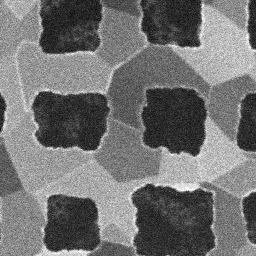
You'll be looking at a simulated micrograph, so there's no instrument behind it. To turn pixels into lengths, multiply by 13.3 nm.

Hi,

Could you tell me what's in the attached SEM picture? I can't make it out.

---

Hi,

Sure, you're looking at holes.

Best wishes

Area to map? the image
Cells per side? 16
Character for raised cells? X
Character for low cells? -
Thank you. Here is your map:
XX----XXX----XX-
XXX---XXX----XX-
XX----XXX----XXX
XXXXXXXXXXXXXXXX
XXXXXXXXXXXXXXXX
XXXXXXXXXX-XXXXX
XX-----XX----XX-
XX-----XX----XX-
XX-----XX----XX-
XXXXXXXXXXX-XXXX
XXXXXXXXXXXXXXXX
XXXXXXXXXXXXXXXX
XXX---XX-----XX-
XXX---XX-----XX-
XXX---XX-----XX-
XXX---XX-----XXX